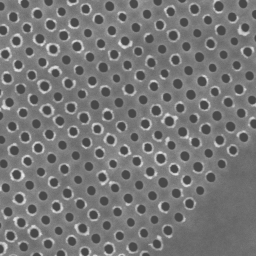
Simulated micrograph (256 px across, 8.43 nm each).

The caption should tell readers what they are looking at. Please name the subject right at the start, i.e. a regular array of holes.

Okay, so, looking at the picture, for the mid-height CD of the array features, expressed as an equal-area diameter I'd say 72.4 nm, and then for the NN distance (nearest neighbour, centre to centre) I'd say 16.8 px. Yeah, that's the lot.